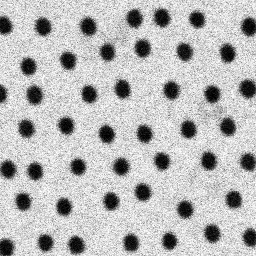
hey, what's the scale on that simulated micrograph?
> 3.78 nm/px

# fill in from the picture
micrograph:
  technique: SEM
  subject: a regular array of holes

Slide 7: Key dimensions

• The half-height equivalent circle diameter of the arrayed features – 0.0608 µm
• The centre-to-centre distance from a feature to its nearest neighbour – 34.3 px